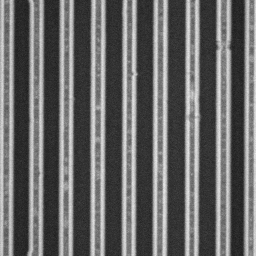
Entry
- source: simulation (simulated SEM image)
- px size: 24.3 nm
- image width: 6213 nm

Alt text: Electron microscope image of parallel lines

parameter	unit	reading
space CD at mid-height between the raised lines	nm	495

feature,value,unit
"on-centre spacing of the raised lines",0.753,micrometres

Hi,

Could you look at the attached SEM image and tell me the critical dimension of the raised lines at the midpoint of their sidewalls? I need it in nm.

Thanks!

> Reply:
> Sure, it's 246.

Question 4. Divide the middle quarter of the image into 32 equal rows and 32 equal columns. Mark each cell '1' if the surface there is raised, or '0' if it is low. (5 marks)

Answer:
11000001110000011000000110000001
11000001110000011000000110000001
11000001110000011100000110000001
11000001110000011000000110000001
11000001110000011000000110000001
11000001110000011000000110000001
11000001110000011000000110000001
11000001110000011000000110000001
11000001110000011000000110000001
11000001110000011000000110000001
11000001110000011000000110000001
11000001110000011000000110000001
11000001110000011000000110000001
11000001110000011000000110000001
11000001110000011000000110000001
11000001110000011000000110000001
11000001110000011000000110000001
11000001110000011000000110000001
11000001110000011000000110000001
11000001110000011000000110000001
11000001110000011000000110000001
11000001110000011000000110000001
11000001110000011000000110000001
11000001110000011000000110000001
11000001110000011000000110000001
11000001110000011000000110000001
11000001110000011000000110000001
11000001110000011000000110000001
11000001110000011000000110000001
11000001110000011000000110000001
11000001110000011000000110000001
11000001110000011000000110000001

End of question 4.